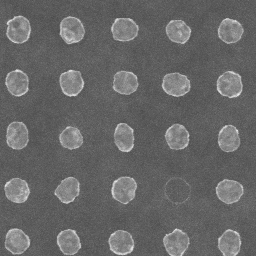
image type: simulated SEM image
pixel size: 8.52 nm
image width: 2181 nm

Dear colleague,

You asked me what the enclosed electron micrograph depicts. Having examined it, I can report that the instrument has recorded a regular array of raised bodies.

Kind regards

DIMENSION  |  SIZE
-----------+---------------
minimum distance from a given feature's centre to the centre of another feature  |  444 nanometers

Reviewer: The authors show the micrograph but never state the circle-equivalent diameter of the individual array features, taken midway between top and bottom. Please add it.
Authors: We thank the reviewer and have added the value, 209 nanometres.